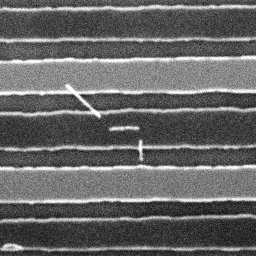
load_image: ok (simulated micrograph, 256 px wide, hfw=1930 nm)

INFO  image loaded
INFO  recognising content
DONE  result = lines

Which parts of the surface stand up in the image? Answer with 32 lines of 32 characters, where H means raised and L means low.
LLLLLLLLLLLLLLLLLLLLLLLLLLLLLLLL
HHHHHHHHHHHHHHHHHHHHHHHHHHHHHHHH
HHHHHHHHHHHHHHHHHHHHHHHHHHHHHHHH
HHHHHHHHHHHHHHHHHHHHHHHHHHHHHHHH
HHHHHHHHHHHHHHHHHHHHHHHHHHHHHHHH
LLLLLLLLLLLLLLLLLLLLLLLLLLLLLLLL
LLLLLLLLLLLLLLLLLLLLLLLLLLLLLLLL
LLLLLHHHHHHHHHHHHHHHHHHHHHHHHHHH
HHHHHHHHHHHHHHHHHHHHHHHHHHHHHHHH
HHHHHHHHHHHHHHHHHHHHHHHHHHHHHHHH
HHHHHHHHHHHHHHHHHHHHHHHHHHHHHHHH
HHHHHHHHHHHHLLLHHHLLLHHHHLLLLLLL
LLLLLLLLLLLLLLLLLLLLLLLLLLLLLLLL
LLLLLLLLLLLLLLLLLLLLLLLLLLLHHLLL
HHHHHHHHHHHHHHHHHHHHHHHHHHHHHHHH
HHHHHHHHHHHHHHHHHHHHHHHHHHHHHHHH
HHHHHHHHHHHHHHHHHHHHHHHHHHHHHHHH
HHHHHHHHHHHHHHHHHHHHHHHHHHHHHHHH
HHHHHHHHLLHHHHLLLHLLLLLLLLLLLLLL
LLLLLLLLLLLLLLLLLLLLLLLLLLLLLLLL
LLLLLLLLLLLLLLLLLLLLLLLLLLLLLLLL
HHHHHHHHHHHHHHHHHHHHHHHHHHHHHHHH
HHHHHHHHHHHHHHHHHHHHHHHHHHHHHHHH
HHHHHHHHHHHHHHHHHHHHHHHHHHHHHHHH
HHHHHHHHHHHHHHHHHHHHHHHHHHHHHHHH
LLLLLLLLLLLLLLLLLLLLLLLLLLLLLLLL
LLLLLLLLLLLLLLLLLLLLLLLLLLLLLLLL
HHHHHHHHHHHHHHHHHHHHHHHHHHHHHHHH
HHHHHHHHHHHHHHHHHHHHHHHHHHHHHHHH
HHHHHHHHHHHHHHHHHHHHHHHHHHHHHHHH
HHHHHHHHHHHHHHHHHHHHHHHHHHHHHHHH
LLLLLLLLLLLLLLLLLLLLLLLLLLLLLLLL